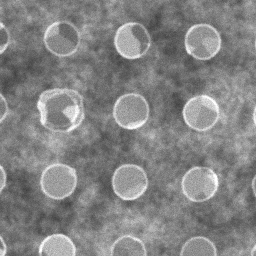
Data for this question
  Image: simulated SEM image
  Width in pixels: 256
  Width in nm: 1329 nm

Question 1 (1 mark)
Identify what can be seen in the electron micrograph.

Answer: a regular array of raised bodies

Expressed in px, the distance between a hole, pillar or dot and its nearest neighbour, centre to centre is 70.2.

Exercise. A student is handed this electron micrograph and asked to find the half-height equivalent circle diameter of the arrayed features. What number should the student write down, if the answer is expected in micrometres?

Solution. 0.178